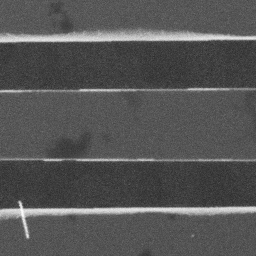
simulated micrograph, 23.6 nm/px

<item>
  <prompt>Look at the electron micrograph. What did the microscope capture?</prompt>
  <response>lines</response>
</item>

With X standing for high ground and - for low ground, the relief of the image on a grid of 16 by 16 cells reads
XXXXXXXXXXXXXXXX
XXXXXXXXXXXXXXXX
----------------
----------------
----------------
----------------
XXXXXXXXXXXXXXXX
XXXXXXXXXXXXXXXX
XXXXXXXXXXXXXXXX
XXXXXXXXXXXXXXXX
----------------
----------------
----------------
XXXXXXXXXXXXXXXX
XXXXXXXXXXXXXXXX
XXXXXXXXXXXXXXXX